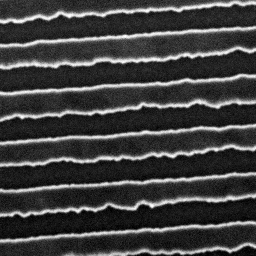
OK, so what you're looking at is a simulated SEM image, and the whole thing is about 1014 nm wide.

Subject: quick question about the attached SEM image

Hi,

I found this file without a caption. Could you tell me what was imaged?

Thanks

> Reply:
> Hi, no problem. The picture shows lines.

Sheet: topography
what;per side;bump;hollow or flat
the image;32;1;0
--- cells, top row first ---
11111111111111111111111111111010
11111111111111110000000000000000
11110000000000000000000000000000
00000000000000000000000000000101
00000000000000011111111111111111
00011111111111111111111111111111
11111111111111111111111111111001
11111111111111111111100000000000
10000000000000000000000000000000
00000000000000000000000000000011
00000000000000000011111111111111
00011111111111111111111111111111
11111111111111111111111111111111
11111111111111111000000000000000
11111100000000000000000000000000
00000000000000000000000000000000
00000000000000000010111111111111
00000111111111111111111111111111
11111111111111111111111111110011
11111111111111111110010000000000
11111100000000000000000000000000
00000000000000000000000000000000
00000000000000000000011111111111
00001111111111111111111111111111
11111111111111111111111111111111
11111111111111111111000000000000
11111110000000000000000000000000
00000000000000000000000000000000
00000000000000000000001111111111
00000001111111111111111111111111
11111111111111111111111111111111
11111111111111111111111110000000